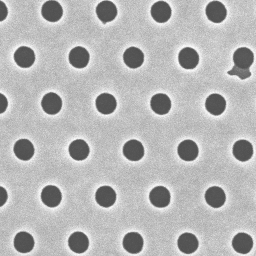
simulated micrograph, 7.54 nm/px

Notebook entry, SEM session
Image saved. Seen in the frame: a regular array of holes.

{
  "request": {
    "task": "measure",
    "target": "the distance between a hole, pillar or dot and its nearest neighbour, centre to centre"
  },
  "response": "403 nm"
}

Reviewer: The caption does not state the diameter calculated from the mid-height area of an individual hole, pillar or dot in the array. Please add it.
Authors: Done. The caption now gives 164 nanometres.